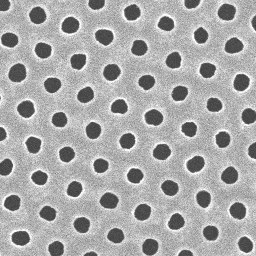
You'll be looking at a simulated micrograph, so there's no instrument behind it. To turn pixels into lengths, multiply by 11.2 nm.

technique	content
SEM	a regular array of holes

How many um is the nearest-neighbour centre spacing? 0.388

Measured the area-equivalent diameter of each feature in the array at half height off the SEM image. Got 185 nm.